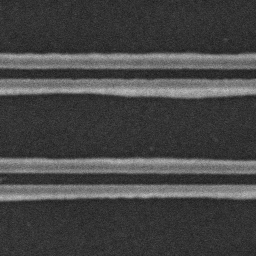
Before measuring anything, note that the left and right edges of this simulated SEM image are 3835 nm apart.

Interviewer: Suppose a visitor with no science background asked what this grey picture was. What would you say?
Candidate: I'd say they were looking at lines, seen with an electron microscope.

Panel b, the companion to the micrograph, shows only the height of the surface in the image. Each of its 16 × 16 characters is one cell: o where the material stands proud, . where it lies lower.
................
................
................
................
oooooooooooooooo
oooooooooooooooo
................
................
................
................
oooooooooooooooo
oooooooooooooooo
................
................
................
................